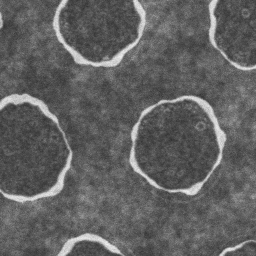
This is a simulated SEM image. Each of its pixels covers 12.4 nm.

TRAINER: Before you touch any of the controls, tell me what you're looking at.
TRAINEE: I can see raised bodies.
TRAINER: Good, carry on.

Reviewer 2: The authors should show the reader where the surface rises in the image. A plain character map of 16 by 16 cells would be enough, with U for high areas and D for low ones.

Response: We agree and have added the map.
DDDDUUUUUDDDDUUU
DDDDUUUUUDDDDUUU
DDDDUUUUUDDDDUUU
DDDDDUUUDDDDDDUU
DDDDDDDDDDDDDDDD
DDDDDDDDDDDDDDDD
UUDDDDDDDDUUUDDD
UUUDDDDDDUUUUDDD
UUUUDDDDUUUUUUDD
UUUUDDDDUUUUUUDD
UUUUDDDDUUUUUDDD
UUUUDDDDDDUUUDDD
DDDDDDDDDDDDDDDD
DDDDDDDDDDDDDDDD
DDDDDDDDDDDDDDDD
DDDDUUUDDDDDDDUU